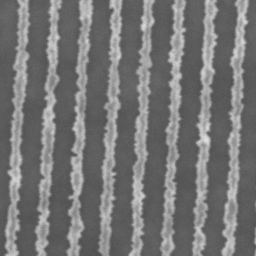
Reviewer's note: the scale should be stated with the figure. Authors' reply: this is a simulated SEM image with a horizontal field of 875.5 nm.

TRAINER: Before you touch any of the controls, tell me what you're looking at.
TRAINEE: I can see parallel lines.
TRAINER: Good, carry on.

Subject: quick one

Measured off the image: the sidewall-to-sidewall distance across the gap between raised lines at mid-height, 82 nanometres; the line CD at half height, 25.2 nanometres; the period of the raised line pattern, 0.106 um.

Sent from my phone